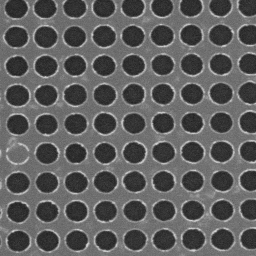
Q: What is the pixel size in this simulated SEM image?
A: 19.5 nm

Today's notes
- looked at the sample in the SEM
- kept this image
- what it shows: a regular array of holes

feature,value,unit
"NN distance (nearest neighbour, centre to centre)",566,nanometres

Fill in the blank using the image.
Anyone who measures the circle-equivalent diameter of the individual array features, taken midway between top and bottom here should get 430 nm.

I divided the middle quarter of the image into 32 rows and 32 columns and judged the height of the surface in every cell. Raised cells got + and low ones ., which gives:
......+......++.....++.....++...
.....++......++.....++.....+++..
+....+++....++++...++++...+++++.
++++++++++++++++++++++++++++++++
++++++++++++++++++++++++++++++++
+....++++...++++...++++....+++..
.....+++.....++.....++.....++...
......+......++.....++......+...
......++.....++.....++.....++...
+....+++....+++.....+++....+++..
++++++++++.+++++++++++++++++++++
++++++++++++++++++++++++++++++++
++..+++++..+++++...++++...+++++.
+....+++.....++.....++.....+++..
......+......++.....++......+...
......+......++.....++......+...
+....+++.....++.....+++....+++..
++..+++++..++++++.++++++++++++++
++++++++++++++++++++++++++++++++
+++++++++++++++++.++++++..+++++.
+....+++....+++.....++.....+++..
.....+++.....++.....++......+...
......+......++.....++......+...
.....+++.....++.....++.....+++..
+...+++++...++++...+++++..++++++
++++++++++++++++++++++++++++++++
++++++++++++++++++++++++++++++++
+....+++....+++.....+++....+++..
......++.....++.....++.....+++..
......+......++.....++......+...
......++.....++.....+++.....++..
+....+++....++++....+++....++++.